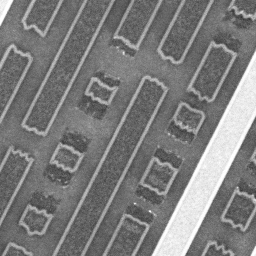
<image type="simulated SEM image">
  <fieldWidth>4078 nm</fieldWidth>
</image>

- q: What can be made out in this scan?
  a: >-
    parallel lines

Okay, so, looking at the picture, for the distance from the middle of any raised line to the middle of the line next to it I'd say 704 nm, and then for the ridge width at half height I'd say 0.406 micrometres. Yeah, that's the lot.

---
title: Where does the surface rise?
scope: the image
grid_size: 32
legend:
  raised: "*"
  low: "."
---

*...***....***..****...***...***
*...***...***...***...****....**
...***...****..****...***.......
....**...***...***...****.......
........****...***...***........
........***.....*...****........
.*.....****.........***...***...
****...***............*..****...
***...****...............****..*
***...***...............****...*
**...****..**.....**....****..**
**...***...***...****...***...**
*...****....**...***.........***
*...***.........****..**.....***
...****.........***...***...****
...***.........****...***...***.
.....*.........***.........****.
..............****........****..
.......**.....***.........****..
.**....***...****........****...
****...***...***...**....****...
***.........****..****..****....
***.........***...***...****....
**.........****....**..****.....
**.........***.........****..**.
*.........****........****...***
*..**.....***.........****..****
...***...****..**....****...***.
...***...***...***...****.....*.
........****..****..****........
........***...***...****..*.....
.**....****..****..****...***...